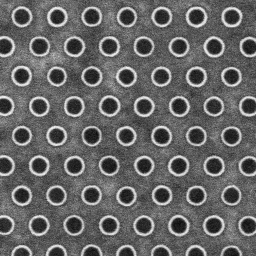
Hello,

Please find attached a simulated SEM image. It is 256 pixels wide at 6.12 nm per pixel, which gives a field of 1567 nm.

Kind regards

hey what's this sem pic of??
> a regular array of raised bodies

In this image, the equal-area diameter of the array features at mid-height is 116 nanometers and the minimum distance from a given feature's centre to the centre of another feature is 210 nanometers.